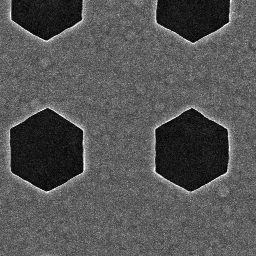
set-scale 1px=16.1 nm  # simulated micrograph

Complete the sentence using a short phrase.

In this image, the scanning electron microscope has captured holes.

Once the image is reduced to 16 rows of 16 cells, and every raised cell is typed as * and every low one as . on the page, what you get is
*....*****....**
*....*****....**
****************
****************
****************
****************
****************
**..*******..***
*....*****....**
*....*****....**
*....*****....**
**..*******..***
****************
****************
****************
****************